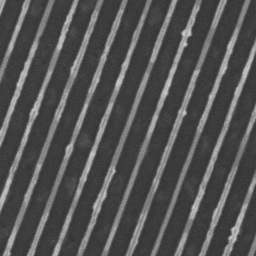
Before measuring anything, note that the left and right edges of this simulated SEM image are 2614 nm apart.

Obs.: parallel lines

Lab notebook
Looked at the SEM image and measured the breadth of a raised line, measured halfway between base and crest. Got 0.0479 micrometres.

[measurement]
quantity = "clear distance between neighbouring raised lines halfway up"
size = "191 nm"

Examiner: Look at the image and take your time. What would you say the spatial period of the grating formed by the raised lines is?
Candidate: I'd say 234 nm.